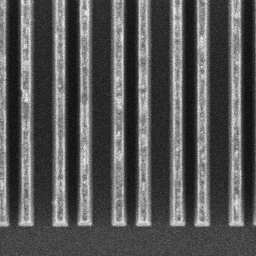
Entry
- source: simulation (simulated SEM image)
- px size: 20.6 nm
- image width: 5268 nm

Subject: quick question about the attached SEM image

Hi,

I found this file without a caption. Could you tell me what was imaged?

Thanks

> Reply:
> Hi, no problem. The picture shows parallel lines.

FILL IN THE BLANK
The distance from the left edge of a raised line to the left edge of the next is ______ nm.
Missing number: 619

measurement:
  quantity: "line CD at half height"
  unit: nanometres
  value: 221